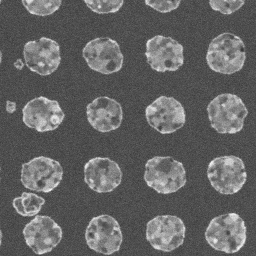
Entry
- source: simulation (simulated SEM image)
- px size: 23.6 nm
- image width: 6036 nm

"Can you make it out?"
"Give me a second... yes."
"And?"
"a regular array of raised bodies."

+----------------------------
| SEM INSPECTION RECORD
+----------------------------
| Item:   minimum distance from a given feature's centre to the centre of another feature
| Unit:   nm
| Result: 1390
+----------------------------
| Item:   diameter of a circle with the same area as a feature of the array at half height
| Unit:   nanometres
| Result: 863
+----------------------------